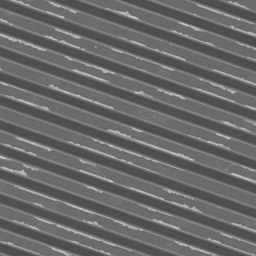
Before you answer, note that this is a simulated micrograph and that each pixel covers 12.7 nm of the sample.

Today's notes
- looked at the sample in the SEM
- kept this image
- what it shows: parallel lines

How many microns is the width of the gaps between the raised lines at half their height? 0.114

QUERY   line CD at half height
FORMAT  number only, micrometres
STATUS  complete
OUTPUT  0.183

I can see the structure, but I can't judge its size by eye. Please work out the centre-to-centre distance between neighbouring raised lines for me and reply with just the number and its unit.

294 nm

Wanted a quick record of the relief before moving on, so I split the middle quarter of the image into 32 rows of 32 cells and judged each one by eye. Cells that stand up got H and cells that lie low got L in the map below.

HHHHHHHHHLLLLLLHHHHHHHHHHHLLLLLL
HHHHHHHHHHHLLLLLLLHHHHHHHHHHHLLL
LLLHHHHHHHHHHHLLLLLLLHHHHHHHHHHL
LLLLLLHHHHHHHHHHHLLLLLLLHHHHHHHH
HHLLLLLLLHHHHHHHHHHHLLLLLLLHHHHH
HHHHHLLLLLLLHHHHHHHHHHHLLLLLLLHH
HHHHHHHHLLLLLLLHHHHHHHHHHHLLLLLL
LHHHHHHHHHHLLLLLLLHHHHHHHHHHHLLL
LLLHHHHHHHHHHHLLLLLLLHHHHHHHHHHH
LLLLLLHHHHHHHHHHHLLLLLLHHHHHHHHH
HHLLLLLLLHHHHHHHHHHLLLLLLLHHHHHH
HHHHHLLLLLLLHHHHHHHHHHLLLLLLLHHH
HHHHHHHHLLLLLLLHHHHHHHHHHLLLLLLL
LHHHHHHHHHHLLLLLLLHHHHHHHHHHLLLL
LLLLHHHHHHHHHHLLLLLLLHHHHHHHHHHL
LLLLLLHHHHHHHHHHHLLLLLLLHHHHHHHH
HHLLLLLLLHHHHHHHHHHHLLLLLLHHHHHH
HHHHHLLLLLLLHHHHHHHHHHLLLLLLLHHH
HHHHHHHLLLLLLLLHHHHHHHHHHLLLLLLL
HHHHHHHHHHLLLLLLLHHHHHHHHHHHLLLL
LLLHHHHHHHHHHLLLLLLLHHHHHHHHHHHL
LLLLLLHHHHHHHHHHLLLLLLLHHHHHHHHH
HLLLLLLLLHHHHHHHHHHLLLLLLLHHHHHH
HHHHLLLLLLLLHHHHHHHHHHLLLLLLLHHH
HHHHHHHLLLLLLLHHHHHHHHHHHLLLLLLL
HHHHHHHHHHLLLLLLLHHHHHHHHHHHLLLL
LLHHHHHHHHHHHLLLLLLLHHHHHHHHHHLL
LLLLLHHHHHHHHHHHLLLLLLLHHHHHHHHH
HLLLLLLLHHHHHHHHHHLLLLLLLLHHHHHH
HHHHLLLLLLLHHHHHHHHHHLLLLLLLLHHH
HHHHHHHLLLLLLLHHHHHHHHHHLLLLLLLL
HHHHHHHHHHLLLLLLLHHHHHHHHHHLLLLL